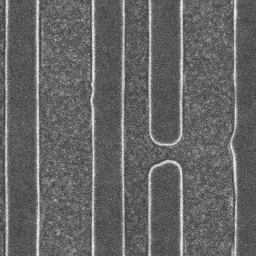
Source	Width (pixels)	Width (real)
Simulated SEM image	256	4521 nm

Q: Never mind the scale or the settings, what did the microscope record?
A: one or a few lines or trenches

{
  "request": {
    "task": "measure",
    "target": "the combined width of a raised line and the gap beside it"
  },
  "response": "1290 nm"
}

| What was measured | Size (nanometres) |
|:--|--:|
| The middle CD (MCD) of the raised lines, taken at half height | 554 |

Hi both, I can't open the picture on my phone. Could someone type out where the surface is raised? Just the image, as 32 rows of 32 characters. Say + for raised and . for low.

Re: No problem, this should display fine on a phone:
.++++.......+++....++++......+++
.++++.......+++....++++......+++
.++++.......+++....++++......+++
.++++.......+++....++++......+++
.++++.......+++....++++......+++
.++++.......+++....++++......+++
.++++.......+++....++++......+++
.++++.......+++....++++......+++
.++++.......+++....++++......+++
.++++.......+++....++++......+++
.++++.......+++....++++......+++
.++++.......+++....++++......+++
.++++......++++....++++......+++
.++++.......+++....++++......+++
.++++.......+++....++++......+++
.++++.......+++....++++......+++
.++++.......+++....++++......+++
.++++.......+++....+++.......+++
.++++.......+++..............+++
.++++.......+++..............+++
.++++.......+++.....++.......+++
.++++.......+++....++++......+++
.++++.......+++....++++......+++
.++++.......+++....++++......+++
.++++.......+++....++++......+++
.++++.......+++....++++......+++
.++++.......+++....++++......+++
.++++.......+++....++++......+++
.++++.......+++....++++......+++
.++++.......+++....++++......+++
.++++.......+++....++++......+++
.++++.......+++....++++......+++